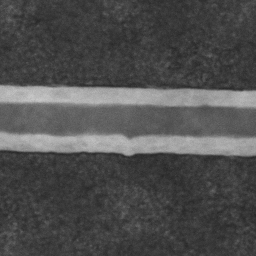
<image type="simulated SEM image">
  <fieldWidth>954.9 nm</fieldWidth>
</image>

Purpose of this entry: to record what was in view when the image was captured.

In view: one or a few lines or trenches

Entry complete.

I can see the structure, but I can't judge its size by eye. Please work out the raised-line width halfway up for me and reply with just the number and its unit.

177 nm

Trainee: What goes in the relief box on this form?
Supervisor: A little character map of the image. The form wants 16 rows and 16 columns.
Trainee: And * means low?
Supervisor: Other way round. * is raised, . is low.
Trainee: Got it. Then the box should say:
................
................
................
................
................
................
****************
****************
****************
................
................
................
................
................
................
................